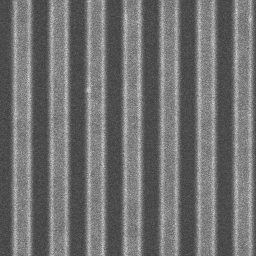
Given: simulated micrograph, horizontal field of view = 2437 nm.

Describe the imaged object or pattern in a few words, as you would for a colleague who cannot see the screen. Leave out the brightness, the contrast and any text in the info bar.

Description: parallel lines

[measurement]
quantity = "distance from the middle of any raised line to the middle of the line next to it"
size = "0.35 microns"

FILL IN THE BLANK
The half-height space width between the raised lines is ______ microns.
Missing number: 0.161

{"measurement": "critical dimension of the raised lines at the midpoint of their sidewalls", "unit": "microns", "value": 0.189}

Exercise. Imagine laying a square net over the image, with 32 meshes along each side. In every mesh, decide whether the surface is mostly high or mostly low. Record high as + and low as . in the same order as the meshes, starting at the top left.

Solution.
..++..+++..++..+++..++...++..+++
..++..+++..++..+++..++...++..+++
..++..+++..++..+++..++...++..+++
..++..+++..++..+++..++...++..+++
..++..+++..++..+++..++...++..+++
..++..+++..++..+++..++...++..+++
..++..+++..++..+++..++...++..+++
..++..+++..++..+++..++...++..+++
..++..+++..++..+++..++...++..+++
..++..+++..++..+++..++...++..+++
..++..+++..++..+++..++...++..+++
..++..+++..++..+++..++...++..+++
..++..+++..++..+++..++...++..+++
..++..+++..++..+++..++...++..+++
..++..+++..++..+++..++...++..+++
..++..+++..++..+++..++...++..+++
..++..+++..++..+++..++...++..+++
..++..+++..++..+++..++...++..+++
..++..+++..++..+++..++...++..+++
..++..+++..++..+++..++...++..+++
..++..+++..++..+++..++...++..+++
..++..+++..++..+++..++...++..+++
..++..+++..++..+++..++...++..+++
..++..+++..++..+++..++...++..+++
..++..+++..++..+++..++...++..+++
..++..+++..++..+++..++...++..+++
..++..+++..++..+++..++...++..+++
..++..+++..++..+++..++...++..+++
..++..+++..++..+++..++...++..+++
..++..+++..++..+++..++...++..+++
..++..+++..++..+++..++...++..+++
..++..+++..++..+++..++...++..+++